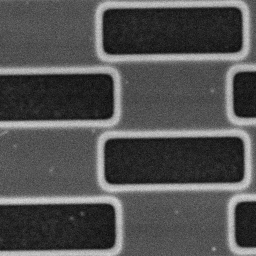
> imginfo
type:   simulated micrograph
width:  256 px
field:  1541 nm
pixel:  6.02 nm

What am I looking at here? groups of lines, slits or small figures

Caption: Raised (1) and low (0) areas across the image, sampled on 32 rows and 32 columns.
11111111111111111111111111111111
11111111111110000000000000000011
11111111111100000000000000000001
11111111111100000000000000000001
11111111111100000000000000000001
11111111111100000000000000000001
11111111111110000000000000000011
11111111111111111111111111111111
11111111111111111111111111111111
00000000000000111111111111111000
00000000000000011111111111111000
00000000000000011111111111111000
00000000000000011111111111111000
00000000000000011111111111111000
00000000000000111111111111111000
11111111111111111111111111111111
11111111111111111111111111111111
11111111111110000000000000000001
11111111111110000000000000000001
11111111111110000000000000000001
11111111111110000000000000000001
11111111111110000000000000000001
11111111111110000000000000000001
11111111111111111111111111111111
11111111111111111111111111111111
00000000000000111111111111111000
00000000000000011111111111111000
00000000000000011111111111111000
00000000000000011111111111111000
00000000000000011111111111111000
00000000000000011111111111111000
00000000000111111111111111111111